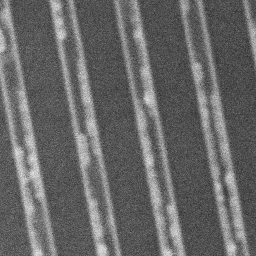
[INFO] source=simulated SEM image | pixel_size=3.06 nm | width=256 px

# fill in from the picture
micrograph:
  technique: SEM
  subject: parallel lines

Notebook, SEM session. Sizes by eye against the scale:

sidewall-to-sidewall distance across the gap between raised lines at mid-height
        133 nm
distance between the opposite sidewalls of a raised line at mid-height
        19.8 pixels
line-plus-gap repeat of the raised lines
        194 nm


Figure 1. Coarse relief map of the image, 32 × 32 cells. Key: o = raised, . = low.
o.....ooo......oo......oo......o
o......oo......oo......oo......o
o......oo......oo......oo......o
o......ooo.....ooo.....ooo.....o
oo.....ooo.....ooo.....ooo.....o
oo.....ooo.....ooo......oo......
oo......oo......oo......oo......
oo......oo......oo......oo......
oo......oo......ooo.....ooo.....
ooo.....ooo.....ooo.....ooo.....
ooo.....ooo.....ooo......oo.....
ooo......oo......oo......oo.....
.oo......oo......oo......oo.....
.oo......oo......oo......ooo....
.ooo.....ooo.....ooo.....ooo....
.ooo.....ooo.....ooo......oo....
.ooo.....ooo......oo......oo....
..oo......oo......oo......oo....
..oo......oo......oo......oo....
..oo......ooo.....ooo.....ooo...
..ooo.....ooo.....ooo.....ooo...
..ooo.....ooo.....ooo......oo...
...oo......oo......oo......oo...
...oo......oo......oo......oo...
...oo......oo......ooo.....ooo..
...ooo.....ooo.....ooo.....ooo..
...ooo.....ooo.....ooo......oo..
...ooo......oo......oo......oo..
....oo......oo......oo......oo..
....oo......oo......oo......ooo.
....ooo.....ooo.....ooo.....ooo.
....ooo.....ooo.....ooo.....ooo.